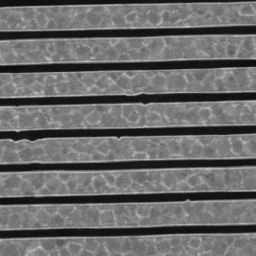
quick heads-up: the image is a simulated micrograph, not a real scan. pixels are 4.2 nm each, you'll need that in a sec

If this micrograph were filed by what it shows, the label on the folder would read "parallel lines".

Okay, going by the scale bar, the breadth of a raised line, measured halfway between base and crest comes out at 0.101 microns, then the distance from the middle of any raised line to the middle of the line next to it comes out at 0.139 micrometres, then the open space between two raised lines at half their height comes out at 36.2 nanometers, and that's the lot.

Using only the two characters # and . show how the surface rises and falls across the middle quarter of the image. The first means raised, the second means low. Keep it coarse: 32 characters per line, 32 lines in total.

................................
...........................#####
################################
################################
################################
################################
################################
###################.............
................................
................................
################################
################################
################################
################################
################################
###############################.
................................
................................
....#########.##################
################################
################################
################################
################################
################################
####............................
................................
....................############
################################
################################
################################
################################
################################